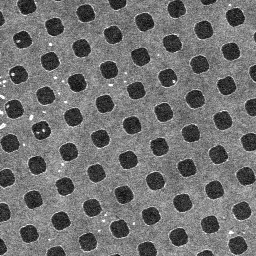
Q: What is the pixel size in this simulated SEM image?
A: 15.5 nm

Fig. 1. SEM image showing a regular array of raised bodies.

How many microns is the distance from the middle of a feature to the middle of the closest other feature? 0.529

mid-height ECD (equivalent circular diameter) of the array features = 303 nm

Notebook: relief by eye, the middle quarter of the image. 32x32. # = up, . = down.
.........####.....##............
.........#####...........##.....
...#.....#####..........####....
.####.....##............####....
.#####............#.....####....
.#####..........####.....##.....
..###...........####............
................####...........#
........####.....##...........##
........####...................#
........#####..........####....#
.###....####...........####.....
####...................####.....
#####..........###.....####.....
#####..........####.............
.##............####...........##
........##.....####..........###
.......####.....##...........###
.......####............##.....##
.......#####..........####.....#
###.....###..........#####......
###...................####......
####..........####....###.......
###...........####..............
..............####...........###
......####....####..........####
......####...................###
......####...........###.....###
#.....####..........#####.......
##.....##...........#####.......
###...........##.....####.......
###..........####.....##........